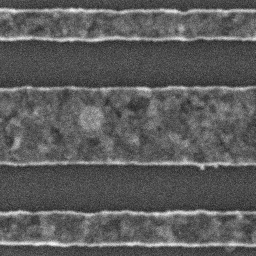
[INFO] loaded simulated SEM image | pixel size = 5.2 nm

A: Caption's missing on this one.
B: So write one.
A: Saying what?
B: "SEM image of lines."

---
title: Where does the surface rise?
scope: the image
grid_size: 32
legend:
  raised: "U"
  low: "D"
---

DDDDDDDDDDDDDDDDDDDDDDDDDDDDDDDD
UUUUUUUUUUUUUUUUUUUUUUDUUUUUUUUU
UUUUUUUUUUUUUUUUUUUUUUUUUUUUUUUU
UUUUUUUUUUUUUUUUUUUUUUUUUUUUUUUU
UUUUUUUUUUUUUUUUUUUUUUUUUUUUUUUU
DDDDDDDDDDDDDDDDDDDDDDDDDDDDDDDD
DDDDDDDDDDDDDDDDDDDDDDDDDDDDDDDD
DDDDDDDDDDDDDDDDDDDDDDDDDDDDDDDD
DDDDDDDDDDDDDDDDDDDDDDDDDDDDDDDD
DDDDDDDDDDDDDDDDDDDDDDDDDDDDDDDD
DDDDDDDDDDDDDDDDDDDDDDDDDDDDDDDD
UUUUUUUUUUUUUUUUUUUUUUUUUUUUUUUU
UUUUUUUUUUUUUUUUUUUUUUUUUUUUUUUU
UUUUUUUUUUUUUUUUUUUUUUUUUUUUUUUU
UUUUUUUUUUUUUUUUUUUUUUUUUUUUUUUU
UUUUUUUUUUUUUUUUUUUUUUUUUUUUUUUU
UUUUUUUUUUUUUUUUUUUUUUUUUUUUUUUU
UUUUUUUUUUUUUUUUUUUUUUUUUUUUUUUU
UUUUUUUUUUUUUUUUUUUUUUUUUUUUUUUU
UUUUUUUUUUUUUUUUUUUUUUUUUUUUUUUU
UUUUUUUDUDDDDUDDDUUUUUUUUUUUUUUU
DDDDDDDDDDDDDDDDDDDDDDDDDDDDDDDD
DDDDDDDDDDDDDDDDDDDDDDDDDDDDDDDD
DDDDDDDDDDDDDDDDDDDDDDDDDDDDDDDD
DDDDDDDDDDDDDDDDDDDDDDDDDDDDDDDD
DDDDDDDDDDDDDDDDDDDDDDDDDDDDDDDD
DDUDDDDDDDDDDDDUDDDDDDDDUUDDDDDD
UUUUUUUUUUUUUUUUUUUUUUUUUUUUUUUU
UUUUUUUUUUUUUUUUUUUUUUUUUUUUUUUU
UUUUUUUUUUUUUUUUUUUUUUUUUUUUUUUU
DUUUUUUUUUUUUUUUUUUUUUUUUUUUUUUU
DDDDDDDDDDDDDDDDDDDDDDDDDDDDDDDD